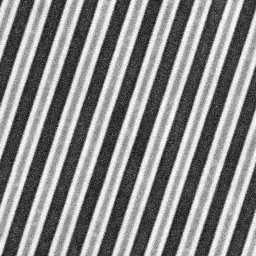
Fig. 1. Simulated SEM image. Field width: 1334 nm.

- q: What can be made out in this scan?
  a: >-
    parallel lines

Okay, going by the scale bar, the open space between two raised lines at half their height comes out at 93.6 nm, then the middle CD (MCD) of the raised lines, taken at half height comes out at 63.8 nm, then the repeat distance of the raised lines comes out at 159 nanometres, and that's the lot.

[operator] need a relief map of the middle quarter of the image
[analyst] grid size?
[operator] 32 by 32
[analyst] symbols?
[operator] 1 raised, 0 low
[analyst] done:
00001110000011100000111000001110
00001110000011100000111000001110
00011100000111100001110000011110
00011100000111000001110000011100
00011100000111000001110000011100
00111100001111000011100000111100
00111000001110000011100000111000
00111000001110000011100000111000
01111000011110000111000001111000
01110000011100000111000001110000
01110000011100000111000001110000
11110000111100001111000011110000
11100000111000001110000011100000
11100000111000001110000011100000
11100001111000011100000111100000
11000001110000011100000111000001
11000001110000011100000111000001
11000011110000111000001111000001
10000011100000111000001110000011
10000011100000111000001110000011
10000011100000110000011110000011
00000111000001110000011100000111
00000111000001110000011100000111
00000111000001110000111100000111
00001110000011100000111000001110
00001110000011100000111000001110
00001110000011100000111000001110
00011110000111000001110000011100
00011100000111000001110000011100
00011100000111000001110000011100
00111100001110000011100000111000
00111000001110000011100000111000